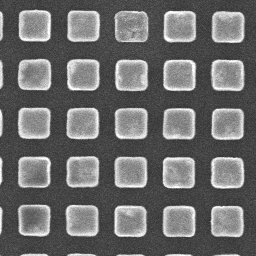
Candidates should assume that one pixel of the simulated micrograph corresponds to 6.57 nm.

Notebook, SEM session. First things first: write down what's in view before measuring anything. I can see a regular array of raised bodies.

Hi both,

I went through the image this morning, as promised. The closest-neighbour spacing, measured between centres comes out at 0.315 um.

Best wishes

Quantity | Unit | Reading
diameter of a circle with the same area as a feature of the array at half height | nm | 226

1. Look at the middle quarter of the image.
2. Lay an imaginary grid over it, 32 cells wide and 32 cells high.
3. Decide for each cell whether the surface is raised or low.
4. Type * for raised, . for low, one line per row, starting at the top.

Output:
.********....********....*******
.********....********....*******
.********....********....*******
.********....********....*******
.********....********....*******
.********....********....*******
...............*****......******
................................
................................
................................
................................
.*******.....********.....******
.********....********....*******
.********....********....*******
.********....********....*******
.********....*******.....*******
.********....*******.....*******
.********....*******.....*******
..******......******.....*******
................................
................................
................................
................................
..******......******......******
.********....*******.....*******
.********....*******.....*******
.********....*******.....*******
.********....*******.....*******
.********....*******.....*******
.********....*******.....*******
..******.....*******.....*******
................................